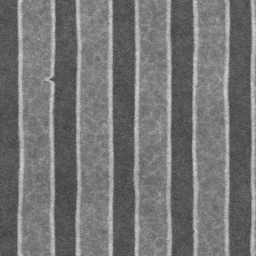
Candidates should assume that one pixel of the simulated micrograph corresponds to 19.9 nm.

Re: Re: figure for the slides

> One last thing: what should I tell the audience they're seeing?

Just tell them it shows parallel lines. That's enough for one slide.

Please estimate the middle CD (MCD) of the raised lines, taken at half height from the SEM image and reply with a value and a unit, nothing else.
636 nm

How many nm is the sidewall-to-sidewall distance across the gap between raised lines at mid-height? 536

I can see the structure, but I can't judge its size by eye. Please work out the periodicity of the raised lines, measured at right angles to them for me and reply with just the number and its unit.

1160 nm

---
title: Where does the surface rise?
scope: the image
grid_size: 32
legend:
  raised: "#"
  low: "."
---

..#####...####...####...####....
..#####...####...####...####....
..#####...####...####....###....
...####...####...####....###....
...####...####...####....###....
...####...####...####....###....
...####...####...####....###....
...####...####...####....###....
...###....####...####....###....
...###....####...####....###....
...###....####...####...####....
...###....####...####...####....
...###....####...####...####....
...###....####...####...####....
...###....####...####...####....
...###....####...####...####....
...###....####...####...####....
...###....####...####...####....
...###....####...####...####....
...###....####...####...####....
...###....####...####...####....
...###....####...####...####....
...###....####...####....###....
...###....####...####....###....
...###....####...####....###....
...###....####...####....###....
..####....####...####...####....
..####....####...####...####....
..####....####...####...####....
..####....####...####....###....
..####....####...####....###....
..#####...####...####....###....